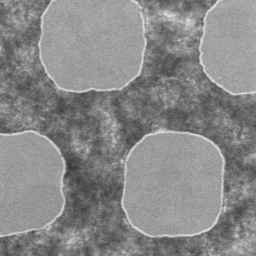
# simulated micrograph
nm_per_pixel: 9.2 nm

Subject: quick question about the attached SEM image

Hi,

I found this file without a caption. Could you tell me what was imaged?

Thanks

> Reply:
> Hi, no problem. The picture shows raised bodies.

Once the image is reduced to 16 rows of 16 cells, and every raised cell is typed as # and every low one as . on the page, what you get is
...######....###
...######....###
...######....###
...######....###
...######....###
....####......##
................
................
###......###....
####....######..
####....######..
####....######..
####....######..
####....######..
#.#......####...
................